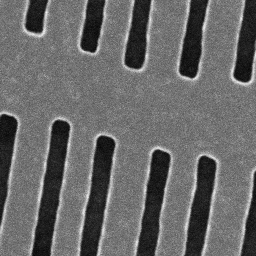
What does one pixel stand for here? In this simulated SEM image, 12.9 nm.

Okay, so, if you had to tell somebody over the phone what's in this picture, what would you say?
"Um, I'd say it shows holes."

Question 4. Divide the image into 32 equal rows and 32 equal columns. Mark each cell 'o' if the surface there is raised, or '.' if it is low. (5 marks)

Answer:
ooo...ooooo..oooo..ooooo..ooooo.
ooo...ooooo..oooo..ooooo..oooo..
ooo...ooooo..ooo...oooo...oooo..
ooo..ooooo...ooo...oooo..ooooo..
oooooooooo..oooo..ooooo..ooooo..
oooooooooo..oooo..ooooo..ooooo..
ooooooooooo.oooo..ooooo..ooooo..
ooooooooooooooo...ooooo..oooo...
oooooooooooooooo..oooo...oooo...
ooooooooooooooooooooooo.ooooo..o
oooooooooooooooooooooooooooooooo
oooooooooooooooooooooooooooooooo
oooooooooooooooooooooooooooooooo
oooooooooooooooooooooooooooooooo
.ooooooooooooooooooooooooooooooo
..ooooo..ooooooooooooooooooooooo
..oooo...ooooooooooooooooooooooo
..oooo...ooo..oooooooooooooooooo
..oooo..oooo..oooooooooooooooooo
..oooo..oooo..ooooo..oooo.oooooo
.ooooo..oooo..ooooo..oooo..ooooo
.ooooo..ooo...ooooo..oooo..ooooo
.oooo...ooo...oooo...oooo..ooooo
.oooo...ooo...oooo...ooo...ooooo
.oooo...ooo...oooo...ooo...oooo.
.oooo..oooo..ooooo..oooo..ooooo.
ooooo..oooo..ooooo..oooo..ooooo.
ooooo..ooo...ooooo..oooo..ooooo.
oooo...ooo...ooooo..oooo..ooooo.
oooo...ooo...oooo...ooo...oooo..
oooo...ooo..ooooo...ooo...oooo..
oooo..oooo..ooooo..oooo..ooooo..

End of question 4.